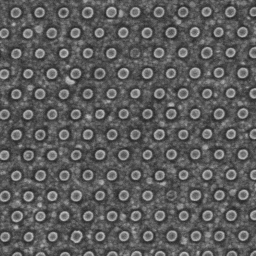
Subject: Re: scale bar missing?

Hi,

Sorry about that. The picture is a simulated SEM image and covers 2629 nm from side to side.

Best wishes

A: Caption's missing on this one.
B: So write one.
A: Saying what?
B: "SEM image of a regular array of raised bodies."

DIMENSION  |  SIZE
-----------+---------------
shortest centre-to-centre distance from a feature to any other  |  240 nm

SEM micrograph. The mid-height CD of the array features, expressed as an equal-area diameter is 9.67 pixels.